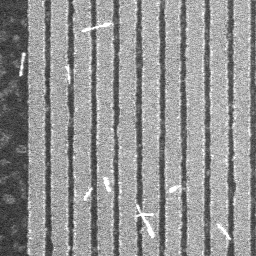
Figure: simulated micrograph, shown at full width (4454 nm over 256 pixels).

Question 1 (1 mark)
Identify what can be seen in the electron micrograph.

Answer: parallel lines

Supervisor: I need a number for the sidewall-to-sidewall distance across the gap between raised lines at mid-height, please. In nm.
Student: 270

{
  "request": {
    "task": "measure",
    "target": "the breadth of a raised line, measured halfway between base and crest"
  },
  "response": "6.75 pixels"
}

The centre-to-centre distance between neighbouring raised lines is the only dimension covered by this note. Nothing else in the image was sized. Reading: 398 nanometres